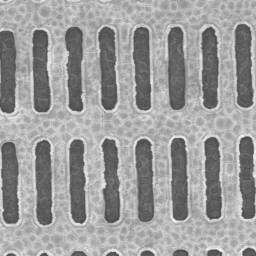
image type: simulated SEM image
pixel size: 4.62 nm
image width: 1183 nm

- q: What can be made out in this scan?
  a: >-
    a regular array of holes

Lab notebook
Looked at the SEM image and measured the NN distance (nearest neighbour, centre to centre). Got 155 nm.